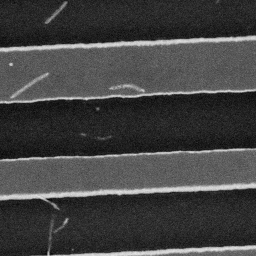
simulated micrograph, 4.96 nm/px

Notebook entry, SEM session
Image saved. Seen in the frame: lines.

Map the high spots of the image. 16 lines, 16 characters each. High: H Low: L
LLLLLLLLLLLLLLLL
LLLLLLLLLLLLLLLL
LLLLLLLLLLLHHHHH
HHHHHHHHHHHHHHHH
HHHHHHHHHHHHHHHH
HHHHHHHHHHHHHHHH
LLLLLLLLLLLLLLLL
LLLLLLLLLLLLLLLL
LLLLLLLLLLLLLLLL
LLLLLLLLLLHHHHHH
HHHHHHHHHHHHHHHH
HHHHHHHHHHHHHHHH
LLLLLLLLLLLLLLLL
LLLLLLLLLLLLLLLL
LLLLLLLLLLLLLLLL
LLLLLLLLLLLLLHHH